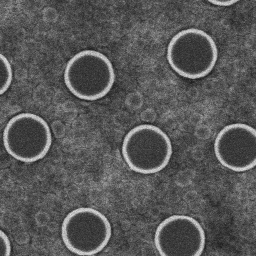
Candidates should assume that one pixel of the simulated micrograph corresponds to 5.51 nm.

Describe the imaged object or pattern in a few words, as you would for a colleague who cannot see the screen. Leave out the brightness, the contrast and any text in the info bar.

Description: raised bodies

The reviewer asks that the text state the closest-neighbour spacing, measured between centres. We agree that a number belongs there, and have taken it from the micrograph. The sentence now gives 0.516 micrometres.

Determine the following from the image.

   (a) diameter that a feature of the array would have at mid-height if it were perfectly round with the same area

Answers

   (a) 253 nanometres